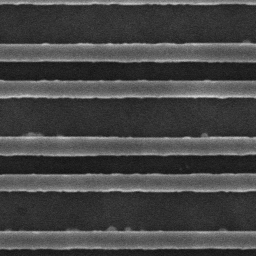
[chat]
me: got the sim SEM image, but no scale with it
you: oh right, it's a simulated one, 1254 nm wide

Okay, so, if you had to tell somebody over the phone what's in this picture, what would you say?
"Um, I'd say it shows lines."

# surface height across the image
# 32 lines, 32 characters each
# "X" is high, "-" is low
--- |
--X-XXX-XXX----X-X--XX-XXXXX---X
--------------------------------
--------------------------------
--------------------------------
--------------------------------
-----X---XXX-X-XXXXXXX-XXXXXXXXX
XXXXXXXXXXXXXXXXXXXXXXXXXXXXXXXX
XXXXXXXXXXXXXXXXXXXXXXXXXXXXXXXX
--------------------------------
--------------------------------
XXXXXXXXXXXXXXXXXXXXXXXXXXXXXXXX
XXXXXXXXXXXXXXXXXXXXXXXXXXXXXXXX
--------------------------------
--------------------------------
--------------------------------
--------------------------------
--------------------------------
XXXXXXXXXXXXXXXXXXXXXXXXXXXXXXXX
XXXXXXXXXXXXXXXXXXXXXXXXXXXXXXXX
--------------------------------
--------------------------------
--------------------------------
XXXXXXXXXXXXXXXXXXXXXXXXXXXXXXXX
XXXXXXXXXXXXXXXXXXXXXXXXXXXXXXXX
--------------------------------
--------------------------------
--------------------------------
--------------------------------
--------------------------------
XXXXXXXXXXXXXXXXXXXXXXXXXXXXXXXX
XXXXXXXXXXXXXXXXXXXXXXXXXXXXXXXX
--------------------------------